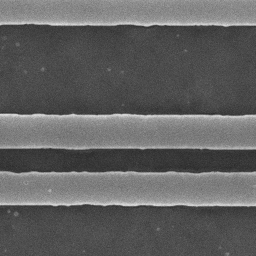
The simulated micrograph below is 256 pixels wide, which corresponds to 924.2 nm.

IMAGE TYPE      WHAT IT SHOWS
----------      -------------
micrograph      lines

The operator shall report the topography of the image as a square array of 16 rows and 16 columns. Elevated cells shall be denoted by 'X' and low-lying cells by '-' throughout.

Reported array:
XXXXXXXXXXXXXXXX
XXXXXXXXXXXXXXXX
----------------
----------------
----------------
----------------
----------------
XXXXXXXXXXXXXXXX
XXXXXXXXXXXXXXXX
----------------
----------------
XXXXXXXXXXXXXXXX
XXXXXXXXXXXXXXXX
----------------
----------------
----------------